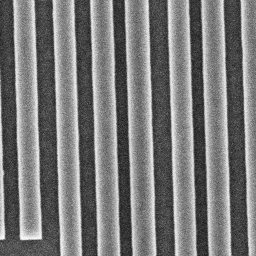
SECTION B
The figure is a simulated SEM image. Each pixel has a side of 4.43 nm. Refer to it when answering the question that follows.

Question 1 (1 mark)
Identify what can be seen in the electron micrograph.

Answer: parallel lines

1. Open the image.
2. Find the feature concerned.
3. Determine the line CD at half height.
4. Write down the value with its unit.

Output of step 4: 94.6 nanometers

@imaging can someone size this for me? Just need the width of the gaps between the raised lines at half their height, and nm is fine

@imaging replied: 74.7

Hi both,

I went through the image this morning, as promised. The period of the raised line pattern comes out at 167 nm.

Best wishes